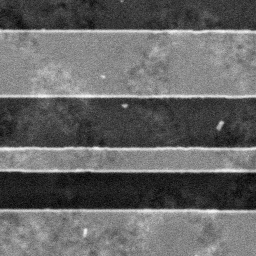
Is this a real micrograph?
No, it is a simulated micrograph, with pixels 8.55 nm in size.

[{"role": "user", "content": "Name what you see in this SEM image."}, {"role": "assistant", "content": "lines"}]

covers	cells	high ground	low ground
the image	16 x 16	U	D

DDDDDDDDDDDDDDDD
DDDDDDDDDDDDDDDD
UUUUUUUUUUUUUUUU
UUUUUUUUUUUUUUUU
UUUUUUUUUUUUUUUU
UUUUUUUUUUUUUUUU
DDDDDDDDDDDDDDDD
DDDDDDDDDDDDDDDD
DDDDDDDDDDDDDDDD
UUUUUUUUUUUUUUUU
UUUUUUUUUUUUUUUU
DDDDDDDDDDDDDDDD
DDDDDDDDDDDDDDDD
UUUUUUUUUUUUUUUU
UUUUUUUUUUUUUUUU
UUUUUUUUUUUUUUUU